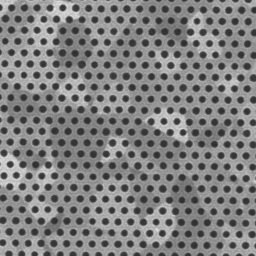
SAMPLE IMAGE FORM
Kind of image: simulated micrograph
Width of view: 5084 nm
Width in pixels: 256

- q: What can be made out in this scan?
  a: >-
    a regular array of holes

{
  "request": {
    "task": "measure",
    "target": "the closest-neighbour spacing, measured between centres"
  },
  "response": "247 nanometers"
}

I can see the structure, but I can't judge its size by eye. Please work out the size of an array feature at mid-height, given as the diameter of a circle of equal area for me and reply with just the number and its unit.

152 nm